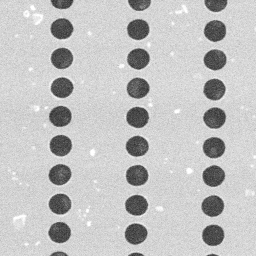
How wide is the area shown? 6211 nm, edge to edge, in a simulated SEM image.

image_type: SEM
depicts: a regular array of holes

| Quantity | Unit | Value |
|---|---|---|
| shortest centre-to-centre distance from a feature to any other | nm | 700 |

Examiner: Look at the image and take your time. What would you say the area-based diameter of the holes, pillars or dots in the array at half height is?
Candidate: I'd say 550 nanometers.